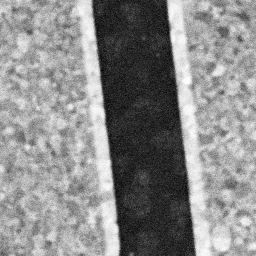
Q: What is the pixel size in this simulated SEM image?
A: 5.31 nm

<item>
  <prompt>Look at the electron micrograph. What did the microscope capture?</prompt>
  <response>one or a few lines or trenches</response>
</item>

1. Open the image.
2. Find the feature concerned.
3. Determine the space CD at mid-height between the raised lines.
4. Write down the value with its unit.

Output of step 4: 481 nanometres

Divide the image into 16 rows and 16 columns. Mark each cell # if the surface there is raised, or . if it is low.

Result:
#####......#####
#####......#####
#####......#####
######.....#####
######.....#####
######......####
######......####
######......####
######......####
######......####
######......####
#######.....####
#######.....####
#######.....####
#######......###
#######......###